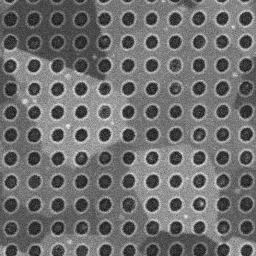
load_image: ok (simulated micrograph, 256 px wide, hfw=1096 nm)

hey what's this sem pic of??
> a regular array of holes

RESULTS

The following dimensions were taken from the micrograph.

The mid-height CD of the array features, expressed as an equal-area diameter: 0.0609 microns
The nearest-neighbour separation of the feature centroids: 98.1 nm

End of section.